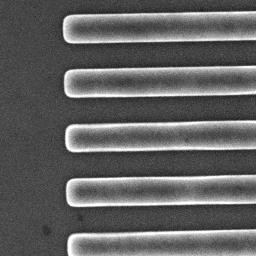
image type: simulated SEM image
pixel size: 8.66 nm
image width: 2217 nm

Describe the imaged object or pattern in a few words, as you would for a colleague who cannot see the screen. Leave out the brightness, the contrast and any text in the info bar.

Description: groups of lines, slits or small figures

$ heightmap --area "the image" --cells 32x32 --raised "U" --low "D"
DDDDDDDDDDDDDDDDDDDDDDDDDDDDDDDD
DDDDDDDDDDDDDDDDDDDDDDDDDDDDDDDD
DDDDDDDDUUUUUUUUUUUUUUUUUUUUUUUU
DDDDDDDDUUUUUUUUUUUUUUUUUUUUUUUU
DDDDDDDDUUUUUUUUUUUUUUUUUUUUUUUU
DDDDDDDDDDDDDDDDDDDDDDDDDDDDDDDD
DDDDDDDDDDDDDDDDDDDDDDDDDDDDDDDD
DDDDDDDDDDDDDDDDDDDDDDDDDDDDDDDD
DDDDDDDDDDDDDDDDDDDDDDDDDUUUUUUU
DDDDDDDDUUUUUUUUUUUUUUUUUUUUUUUU
DDDDDDDDUUUUUUUUUUUUUUUUUUUUUUUU
DDDDDDDDUUUUUUUUUUUUUUUUUUUUUUUU
DDDDDDDDDDDDDDDDDDDDDDDDDDDDDDDD
DDDDDDDDDDDDDDDDDDDDDDDDDDDDDDDD
DDDDDDDDDDDDDDDDDDDDDDDDDDDDDDDD
DDDDDDDDDDDDDDDDDDDDDDDUUUUUUUUU
DDDDDDDDUUUUUUUUUUUUUUUUUUUUUUUU
DDDDDDDDUUUUUUUUUUUUUUUUUUUUUUUU
DDDDDDDDDUUUUUUUUUUUUUUUUUUUUUUU
DDDDDDDDDDDDDDDDDDDDDDDDDDDDDDDD
DDDDDDDDDDDDDDDDDDDDDDDDDDDDDDDD
DDDDDDDDDDDDDDDDDDDDDDDDDDDDDDDD
DDDDDDDDDDDUUUUUUUUUUUUUUUUUUUUU
DDDDDDDDUUUUUUUUUUUUUUUUUUUUUUUU
DDDDDDDDUUUUUUUUUUUUUUUUUUUUUUUU
DDDDDDDDDUUUUUUUUUUUUDDDDDDDDDDD
DDDDDDDDDDDDDDDDDDDDDDDDDDDDDDDD
DDDDDDDDDDDDDDDDDDDDDDDDDDDDDDDD
DDDDDDDDDDDDDDDDDDDDDDDDDDDDDDDD
DDDDDDDDDUUUUUUUUUUUUUUUUUUUUUUU
DDDDDDDDDUUUUUUUUUUUUUUUUUUUUUUU
DDDDDDDDDUUUUUUUUUUUUUUUUUUUUUUU